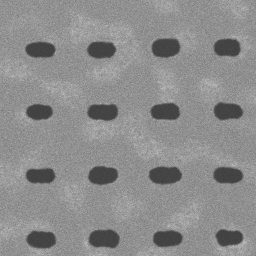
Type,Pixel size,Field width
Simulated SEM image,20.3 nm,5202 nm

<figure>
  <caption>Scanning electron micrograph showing a regular array of holes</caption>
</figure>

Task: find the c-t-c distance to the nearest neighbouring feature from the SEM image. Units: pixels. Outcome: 62.2